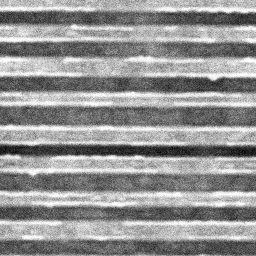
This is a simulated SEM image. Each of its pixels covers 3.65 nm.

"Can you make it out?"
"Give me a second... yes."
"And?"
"parallel lines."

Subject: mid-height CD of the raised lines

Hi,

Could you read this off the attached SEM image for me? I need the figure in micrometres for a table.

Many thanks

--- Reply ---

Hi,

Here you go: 0.0603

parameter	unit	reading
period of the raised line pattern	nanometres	120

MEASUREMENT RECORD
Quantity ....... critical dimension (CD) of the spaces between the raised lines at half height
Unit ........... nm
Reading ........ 60.3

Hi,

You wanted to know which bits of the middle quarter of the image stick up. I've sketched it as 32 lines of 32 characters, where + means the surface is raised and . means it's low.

++++++++++++++++++++++++++++++++
++++++++++++++++++++++++++++++++
++++++++++++++++++++++++++++++++
................................
................................
................................
................................
+++++++++++++++++++.+++.......++
++++++++++++++++++++++++++++++++
++++++++++++++++++++++++++++++++
................................
................................
................................
................................
................................
..........+.....................
++++++++++++++++++++++++++++++++
++++++++++++++++++++++++++++++++
++++++++++++++++++++++++++++++++
++++++++++++++++++++++++++++++++
................................
................................
................................
++++++++++++++++++++++++++++++++
++++++++++++++++++++++++++++++++
++++++++++++++++++++++++++++++++
++++++++++++++++++++++++++++++++
................................
................................
................................
................................
................................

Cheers